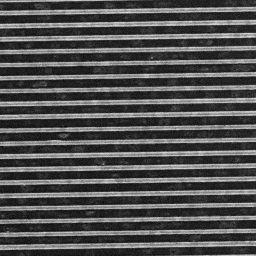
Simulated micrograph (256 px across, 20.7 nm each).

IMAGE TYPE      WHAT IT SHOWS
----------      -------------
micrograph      parallel lines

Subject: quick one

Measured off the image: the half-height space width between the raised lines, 194 nm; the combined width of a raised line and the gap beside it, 13 pixels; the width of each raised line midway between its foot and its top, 0.0776 um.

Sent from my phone